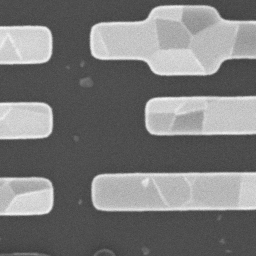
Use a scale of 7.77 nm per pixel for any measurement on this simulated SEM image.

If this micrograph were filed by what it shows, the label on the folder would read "wiring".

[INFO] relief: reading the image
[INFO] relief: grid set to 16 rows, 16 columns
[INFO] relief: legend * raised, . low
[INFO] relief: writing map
..........***...
......**********
***...**********
***...**********
..........***...
................
***......*******
***......*******
***.............
................
................
***...**********
***...**********
................
................
................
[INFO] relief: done